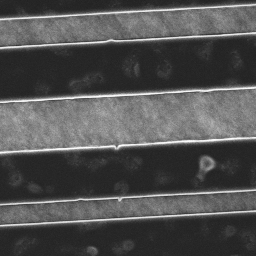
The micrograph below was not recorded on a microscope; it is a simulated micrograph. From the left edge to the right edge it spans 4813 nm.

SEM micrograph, one or a few lines or trenches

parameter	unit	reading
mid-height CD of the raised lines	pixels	53.6